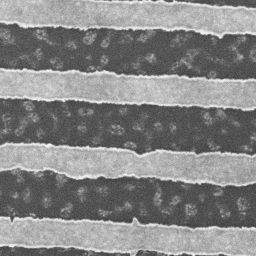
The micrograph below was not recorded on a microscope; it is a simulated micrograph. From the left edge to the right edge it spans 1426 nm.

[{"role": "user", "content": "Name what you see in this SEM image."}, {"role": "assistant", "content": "one or a few lines or trenches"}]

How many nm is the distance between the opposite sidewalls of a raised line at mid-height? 150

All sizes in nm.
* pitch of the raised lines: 413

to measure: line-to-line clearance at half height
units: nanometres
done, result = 262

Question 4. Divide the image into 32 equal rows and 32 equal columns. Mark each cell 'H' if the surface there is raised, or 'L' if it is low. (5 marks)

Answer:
HHHHHHHHHHHHHHHHHHHHHHHHLLLLLLLL
HHHHHHHHHHHHHHHHHHHHHHHHHHHHHHHH
HHHHHHHHHHHHHHHHHHHHHHHHHHHHHHHH
LLLLLLLLLLHLLLLHLHLLHHLHHHHHHHHH
LLLLLLLLLLLLLLLLLLLLLLLLLLLLLLLL
LLLLLLLLLLLLLLLLLLLLLLLLLLLLLLLL
LLLLLLLLLLLLLLLLLLLLLLLLLLLLLLLL
LLLLLLLLLLLLLLLLLLLLLLLLLLLLLLLL
LLLLLLLLLLLLLLLLLLLLLLLLLLLLLLLL
HHHHHHHHHHHHHHHHLLLLLLLLLLLLLLLL
HHHHHHHHHHHHHHHHHHHHHHHHHHHHHHHH
HHHHHHHHHHHHHHHHHHHHHHHHHHHHHHHH
LLLLLLHLLLLHHHHHHHHHHHHHHHHHHHHH
LLLLLLLLLLLLLLLLLLLLLLLLLLLLLLHH
LLLLLLLLLLLLLLLLLLLLLLLLLLLLLLLL
LLLLLLLLLLLLLLLLLLLLLLLLLLLLLLLL
LLLLLLLLLLLLLLLLLLLLLLLLLLLLLLLL
LLLLLLLLLLLLLLLLLLLLLLLLLLLLLLLL
HHHHHHHHHLHLLLLLLLLLLLLLLLLLLLLL
HHHHHHHHHHHHHHHHHHHHHHHHHHHHHHHL
HHHHHHHHHHHHHHHHHHHHHHHHHHHHHHHH
LLLLLLLHHHHHHHHHHHHHHHHHHHHHHHHH
LLLLLLLLLLLLLLLLLLLLLLLHHHHHHHHH
LLLLLLLLLLLLLLLLLLLLLLLLLLLLLLLL
LLLLLLLLLLLLLLLLLLLLLLLLLLLLLLLL
LLLLLLLLLLLLLLLLLLLLLLLLLLLLLLLL
LLLLLLLLLLLLLLLLLLLLLLLLLLLLLLLL
HLHHHHHHLLLLLLLLLLLLLLLLLLLLLLLL
HHHHHHHHHHHHHHHHHHHHHHHHLLHLLLLL
HHHHHHHHHHHHHHHHHHHHHHHHHHHHHHHH
HHHHHHHHHHHHHHHHHHHHHHHHHHHHHHHH
LLLLLLLLLLLLLLLLHLLLHHHHHHHHHHHH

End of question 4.